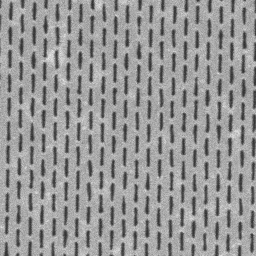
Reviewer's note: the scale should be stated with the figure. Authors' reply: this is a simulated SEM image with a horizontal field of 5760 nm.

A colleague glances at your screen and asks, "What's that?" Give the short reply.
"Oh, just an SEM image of a regular array of holes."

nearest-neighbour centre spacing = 359 nm